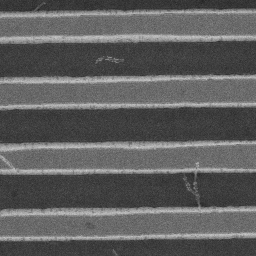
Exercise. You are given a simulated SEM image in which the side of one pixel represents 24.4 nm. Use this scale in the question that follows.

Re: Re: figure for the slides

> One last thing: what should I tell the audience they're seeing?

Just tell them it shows lines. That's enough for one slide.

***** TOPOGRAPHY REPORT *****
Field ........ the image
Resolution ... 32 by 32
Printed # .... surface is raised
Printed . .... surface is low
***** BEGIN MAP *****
................................
................################
################################
################################
################################
................................
................................
................................
................................
.............................###
################################
################################
################################
................................
................................
................................
................................
................................
################################
################################
################################
######################..#.......
................................
................................
................................
................................
################################
################################
################################
################################
................................
................................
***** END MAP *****